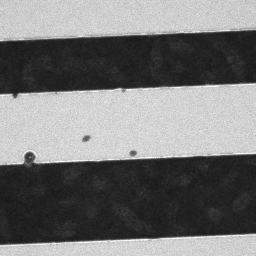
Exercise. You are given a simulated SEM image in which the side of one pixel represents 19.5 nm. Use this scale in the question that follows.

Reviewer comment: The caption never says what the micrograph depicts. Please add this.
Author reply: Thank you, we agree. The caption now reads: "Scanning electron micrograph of one or a few lines or trenches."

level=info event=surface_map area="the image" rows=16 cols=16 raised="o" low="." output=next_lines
................
................
.ooooooooooooooo
oooooooooooooooo
oooooooooooooooo
oooooooooo......
................
................
................
................
oooooooooooooooo
oooooooooooooooo
oooooooooooooooo
oooooooooooooooo
oooooooooooooooo
................